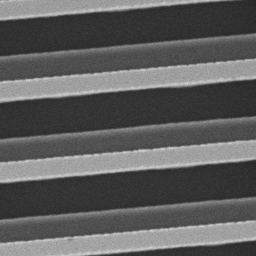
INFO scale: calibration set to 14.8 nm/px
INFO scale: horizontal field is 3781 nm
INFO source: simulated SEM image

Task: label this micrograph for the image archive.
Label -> lines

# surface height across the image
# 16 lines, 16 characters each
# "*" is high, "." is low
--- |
*********.......
................
............****
.***************
****************
**********......
................
..............**
...*************
****************
**********......
................
..............**
...*************
****************
**********......